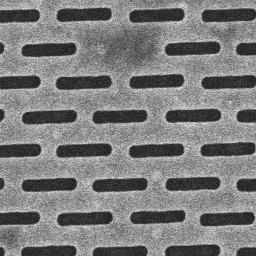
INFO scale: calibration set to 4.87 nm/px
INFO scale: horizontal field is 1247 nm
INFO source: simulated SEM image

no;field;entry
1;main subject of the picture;a regular array of holes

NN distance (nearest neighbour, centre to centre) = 237 nm